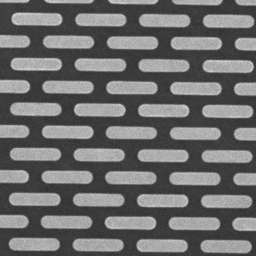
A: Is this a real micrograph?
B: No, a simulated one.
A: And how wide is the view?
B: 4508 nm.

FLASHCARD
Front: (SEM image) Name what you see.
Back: groups of lines, slits or small figures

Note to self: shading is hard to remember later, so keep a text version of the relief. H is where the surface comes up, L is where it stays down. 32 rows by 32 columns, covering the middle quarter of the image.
LLLHHHHHHHHHHHHLLLLHHHHHHHHHHHHL
LLLLLLLHHHHHHHHLLLLHHHHHHHHHHHHL
LLLLLLLLLLLLLLLLLLLLLLLLLLLLLLLL
LLLLLLLLLLLLLLLLLLLLLLLLLLLLLLLL
HHHHHHLLLLLLHHHHHLLLLLLLLLLLLLLL
HHHHHHHLLLLHHHHHHHHHHHHLLLLHHHHH
HHHHHHHLLLLHHHHHHHHHHHHLLLLHHHHH
LLLLLLLLLLLLLLLLLLLLLLLLLLLLLLHH
LLLLLLLLLLLLLLLLLLLLLLLLLLLLLLLL
LLLLLLLLLLLLLLLLLLLLLLLLLLLLLLLL
LLLHHHHHHHHHHHHLLLLHHHHHHHHHHHLL
LLLHHHHHHHHHHHHLLLLHHHHHHHHHHHHL
LLLHHHHHHHHHHHHLLLLHHHHHHHHHHHHL
LLLLLLLLLLLLLLLLLLLLLLLLLLLLLLLL
LLLLLLLLLLLLLLLLLLLLLLLLLLLLLLLL
LLLLLLLLLLLLLLLLLLLLLLLLLLLLLLLL
HHHHHHHLLLLHHHHHHHHHHHHLLLLHHHHH
HHHHHHHLLLLHHHHHHHHHHHHLLLLHHHHH
LHHHHHLLLLLHHHHHHHHHHHLLLLLHHHHH
LLLLLLLLLLLLLLLLLLLLLLLLLLLLLLLL
LLLLLLLLLLLLLLLLLLLLLLLLLLLLLLLL
LLLHHHHHHHHHHLLLLLLLLLLLLLLLLLLL
LLLHHHHHHHHHHHHLLLLHHHHHHHHHHHHL
LLLHHHHHHHHHHHHLLLLHHHHHHHHHHHHL
LLLLLLLLLLLLLLLLLLLLLLLLLLLLLLLL
LLLLLLLLLLLLLLLLLLLLLLLLLLLLLLLL
LLLLLLLLLLLLLLLLLLLLLLLLLLLLLLLL
HHHHHHHLLLLHHHHHHHHHHHLLLLLHHHHH
HHHHHHHLLLLHHHHHHHHHHHHLLLLHHHHH
HHHHHHLLLLLHHHHHHHHHHHHLLLLHHHHH
LLLLLLLLLLLLLLLLLLLLLLLLLLLLLLLL
LLLLLLLLLLLLLLLLLLLLLLLLLLLLLLLL